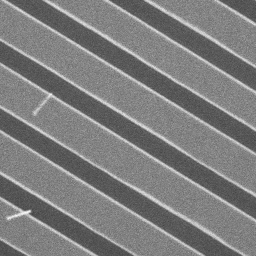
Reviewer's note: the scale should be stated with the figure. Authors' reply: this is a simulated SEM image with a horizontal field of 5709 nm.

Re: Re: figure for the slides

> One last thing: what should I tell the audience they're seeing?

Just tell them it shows lines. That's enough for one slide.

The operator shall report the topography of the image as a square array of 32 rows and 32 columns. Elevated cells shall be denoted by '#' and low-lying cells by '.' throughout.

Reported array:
#.....########.....#########....
###.....########....##########..
#####....#########....#########.
######.....########.....########
########.....########....#######
.#########....########.....#####
..#########.....########.....###
....#########....#########....##
#.....#########....########.....
###....#########.....########...
####.....#########....#########.
######.....#########....########
########....#########.....######
#########.....#########....#####
..#########....#########.....###
...##########....#########.....#
.....#########.....#########....
##.....#########....#########...
####....#########.....#########.
#####.....#########.....########
#######....##########....#######
#########....#########.....#####
.#########.....#########....####
...#########....##########....##
....#########.....#########.....
##....#########.....#########...
####....#########....#########..
#####....#########.....#########
######.....#########.....#######
########.....#########....######
.#########....#########.....####
...########.....#########.....##